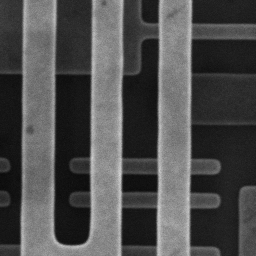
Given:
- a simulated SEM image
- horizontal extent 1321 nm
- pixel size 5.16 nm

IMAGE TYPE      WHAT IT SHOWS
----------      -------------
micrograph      wiring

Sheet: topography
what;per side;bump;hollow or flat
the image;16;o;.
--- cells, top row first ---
.ooo..oo..oo....
.oo...oo..oo....
.oo...oo..oo....
.oo...oo..oo....
.oo...oo..oo....
.oo...oo..oo....
.oo...oo..oo....
.oo...oo..oo....
.oo...oo..oo....
.oo...oo..oo....
.oo...oo..oo....
.oo...oo..oo....
.oo...oo..oo....
.oo...oo..oo....
.oo...oo..oo....
.ooooooo..oo....